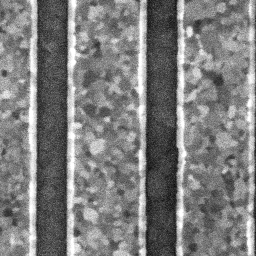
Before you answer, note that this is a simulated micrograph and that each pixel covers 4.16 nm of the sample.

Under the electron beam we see one or a few lines or trenches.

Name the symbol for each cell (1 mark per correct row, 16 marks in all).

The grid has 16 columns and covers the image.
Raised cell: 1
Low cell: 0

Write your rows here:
1100111110011111
1100111110011111
1100111110011111
1100111110011111
1100111110011111
1100111110011111
1100111110011111
1100111110011111
1100111110011111
1100111110011111
1100111110011111
1100111110011111
1100111110011111
1100111110011111
1100111110011111
1100111110011111